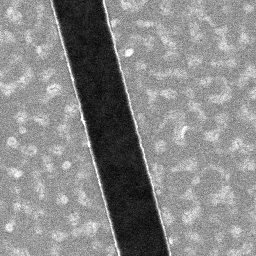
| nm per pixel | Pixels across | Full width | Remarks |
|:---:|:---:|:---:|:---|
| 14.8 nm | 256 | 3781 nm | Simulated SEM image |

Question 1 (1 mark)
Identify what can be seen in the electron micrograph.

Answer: one or a few lines or trenches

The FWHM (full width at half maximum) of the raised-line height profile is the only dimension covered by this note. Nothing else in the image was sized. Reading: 752 nm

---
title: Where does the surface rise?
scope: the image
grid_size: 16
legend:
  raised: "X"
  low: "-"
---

---XXXX---------
----XXX---------
----XXX---------
----XXX---------
----XXXX--------
-----XXX--------
-----XXX--------
-----XXX--------
-----XXXX-------
------XXX-------
------XXX-------
------XXXX------
------XXXX------
-------XXX------
-------XXX------
-------XXXX-----